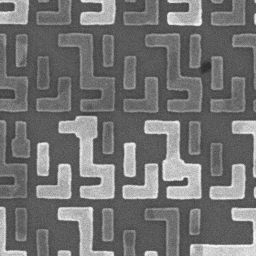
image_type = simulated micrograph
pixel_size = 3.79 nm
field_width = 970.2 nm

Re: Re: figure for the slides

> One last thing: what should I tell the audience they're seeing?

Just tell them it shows wiring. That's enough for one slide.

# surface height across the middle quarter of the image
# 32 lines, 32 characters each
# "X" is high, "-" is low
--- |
----XXX---XX---XXX--------XXX--X
----XXX--------XXX--------XXX---
----XXX--------XXX--------XXX---
X---XXXXXXX----XXX---XX---XXXXXX
X---XXXXXXXX---XXX---XX---XXXXXX
XX--XXXXXXXX---XXX---XX---XXXXXX
X--------XXXX--------XX--------X
X---------XXX--------XX--------X
X--------XXX--------XXX--------X
X---XXXXXXXX---XXXXXXXX---XXXXXX
X---XXXXXXXX---XXXXXXXX---XXXXXX
X----XXXXXXX---XXXXXXXX---XXXXXX
--------------------------------
---XXXXX------------------------
XXXXXXXX-------------XXXX--XX---
XXXXXXXX--XX--------XXXXXXXXX--X
XXXXXXXX--XX--------XXXXXXXXX--X
---XXXXX--XX--------------XXX--X
----XXXX--XX--------------XXX--X
----XXX---XX--------------XXX--X
----XXX---XX---XXX--------XXX--X
----XXX---XX---XXX--------XXX--X
----XXX--------XXX--------XXX---
----XXX--------XXX--------XXX---
----XXX--------XXX-------XXXXX--
X---XXXXXXXX---XXX---XX--XXXXXXX
X---XXXXXXXX---XXX---XX--XXXXXXX
XX--XXXXXXXX---XXX---XX--XXXXXXX
XX-------XXX---------XX--XXXXX-X
XX-------XXX---------XX--------X
X-----XXXXXX---XXXX-XXX-------XX
X---XXXXXXXX---XXXXXXXX---XXXXXX